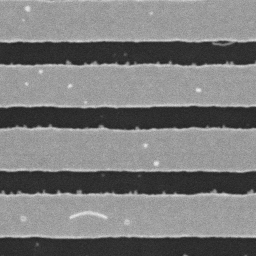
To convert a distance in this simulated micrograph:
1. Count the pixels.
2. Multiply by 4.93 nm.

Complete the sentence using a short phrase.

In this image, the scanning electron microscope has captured lines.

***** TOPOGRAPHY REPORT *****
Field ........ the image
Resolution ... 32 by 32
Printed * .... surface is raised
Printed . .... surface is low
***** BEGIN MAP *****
********************************
********************************
********************************
********************************
********************************
................................
................................
................................
********************************
********************************
********************************
********************************
********************************
................................
................................
................................
********************************
********************************
********************************
********************************
********************************
................................
................................
................................
********************************
********************************
********************************
********************************
********************************
********************************
................................
................................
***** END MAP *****